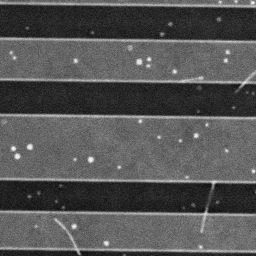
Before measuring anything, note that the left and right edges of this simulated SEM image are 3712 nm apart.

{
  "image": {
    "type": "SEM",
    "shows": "groups of lines, slits or small figures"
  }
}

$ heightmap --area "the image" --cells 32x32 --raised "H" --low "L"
LLLLLLLHHHHHHHHHHHHHHHHHHHHHHHHH
LLLLLLLLLLLLLLLLLLLLLLLLLLLLLLLL
LLLLLLLLLLLLLLLLLLLLLLLLLLLLLLLL
LLLLLLLLLLLLLLLLLLLLLLLLLLLLLLLL
LLLLLLLLLLLLLLLLLLLLLLLLLLLLLLLL
HHHHHHHHHHHHHHHHHHHHHHHHHHHHHHHH
HHHHHHHHHHHHHHHHHHHHHHHHHHHHHHHH
HHHHHHHHHHHHHHHHHHHHHHHHHHHHHHHH
HHHHHHHHHHHHHHHHHHHHHHHHHHHHHHHH
HHHHHHHHHHHHHHHHHHHHHHHHHHHHHHHH
LLLLLLLLLLLLLLLLLLLLLLLLLLLLLLHL
LLLLLLLLLLLLLLLLLLLLLLLLLLLLLLLL
LLLLLLLLLLLLLLLLLLLLLLLLLLLLLLLL
LLLLLLLLLLLLLLLLLLLLLLLLLLLLLLLL
HHHHHHHHHHHHHHLLLLLLLLLLLLLLLLLL
HHHHHHHHHHHHHHHHHHHHHHHHHHHHHHHH
HHHHHHHHHHHHHHHHHHHHHHHHHHHHHHHH
HHHHHHHHHHHHHHHHHHHHHHHHHHHHHHHH
HHHHHHHHHHHHHHHHHHHHHHHHHHHHHHHH
HHHHHHHHHHHHHHHHHHHHHHHHHHHHHHHH
HHHHHHHHHHHHHHHHHHHHHHHHHHHHHHHH
HHHHHHHHHHHHHHHHHHHHHHHHHHHHHHHH
LLLLHHHHHHHHHHHHHHHHHHHHHHHHHHHH
LLLLLLLLLLLLLLLLLLLLLLLLLLLLLLLL
LLLLLLLLLLLLLLLLLLLLLLLLLLLLLLLL
LLLLLLLLLLLLLLLLLLLLLLLLLLLLLLLL
HLLLLLLLLLLLLLLLLLLLLLLLLLLLLLLL
HHHHHHHHHHHHHHHHHHHHHHHHHHHHHHHH
HHHHHHHHHHHHHHHHHHHHHHHHHHHHHHHH
HHHHHHHHHHHHHHHHHHHHHHHHHHHHHHHH
HHHHHHHHHHHHHHHHHHHHHHHHHHHHHHHH
LLLLLLLLLLLLLLLLLLLLLLLLLLLLLLLL